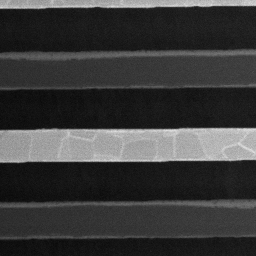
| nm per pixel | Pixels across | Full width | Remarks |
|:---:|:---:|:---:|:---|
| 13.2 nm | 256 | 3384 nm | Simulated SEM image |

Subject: lines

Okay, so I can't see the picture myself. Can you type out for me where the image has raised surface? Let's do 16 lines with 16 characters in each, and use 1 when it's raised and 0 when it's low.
1110000000000000
0000000000000000
0000000000000000
1111111111111111
1111111111111111
1111100000000000
0000000000000000
0000000000000000
1111111111111111
1111111111111111
0000000000000000
0000000000000000
0000000000000000
1111111111111111
1111111111111111
0000000000000000